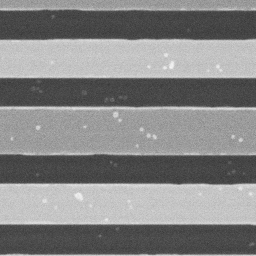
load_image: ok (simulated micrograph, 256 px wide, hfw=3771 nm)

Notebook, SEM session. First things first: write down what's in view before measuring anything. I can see lines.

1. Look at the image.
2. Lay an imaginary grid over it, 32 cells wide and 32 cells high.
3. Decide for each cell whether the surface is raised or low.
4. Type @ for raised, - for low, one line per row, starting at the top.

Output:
@@@@@@@@@@@@@@@@@@@@@@@@@@@@@@@@
--------------------------------
--------------------------------
--------------------------------
--------------------------------
@@@@@@@@@@@@@@@@@@@@@@@@@@@@@@@@
@@@@@@@@@@@@@@@@@@@@@@@@@@@@@@@@
@@@@@@@@@@@@@@@@@@@@@@@@@@@@@@@@
@@@@@@@@@@@@@@@@@@@@@@@@@@@@@@@@
@@@@@@@@@@@@@@@@@@@@@@@@@@@@@@@@
--------------------------------
--------------------------------
--------------------------------
@@@@@@@@@@@@@@@@@-@@@@@@@-------
@@@@@@@@@@@@@@@@@@@@@@@@@@@@@@@@
@@@@@@@@@@@@@@@@@@@@@@@@@@@@@@@@
@@@@@@@@@@@@@@@@@@@@@@@@@@@@@@@@
@@@@@@@@@@@@@@@@@@@@@@@@@@@@@@@@
@@@@@@@@@@@@@@@@@@@@@@@@@@@@@@@@
--------------------------------
--------------------------------
--------------------------------
--------------------------------
@@@@@@@@@@@@@@@@@@@@@@@@@@@@@@@@
@@@@@@@@@@@@@@@@@@@@@@@@@@@@@@@@
@@@@@@@@@@@@@@@@@@@@@@@@@@@@@@@@
@@@@@@@@@@@@@@@@@@@@@@@@@@@@@@@@
@@@@@@@@@@@@@@@@@@@@@@@@@@@@@@@@
--------------------------------
--------------------------------
--------------------------------
--------------------------------